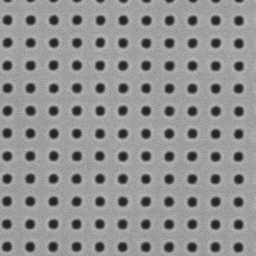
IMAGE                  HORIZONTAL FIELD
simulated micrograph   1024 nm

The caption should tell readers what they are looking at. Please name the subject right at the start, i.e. a regular array of holes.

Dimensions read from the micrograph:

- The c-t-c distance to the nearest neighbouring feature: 90.1 nm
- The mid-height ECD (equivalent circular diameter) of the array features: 40.6 nm